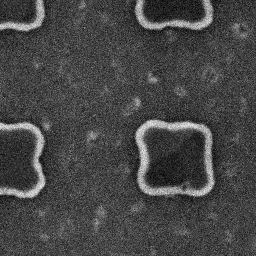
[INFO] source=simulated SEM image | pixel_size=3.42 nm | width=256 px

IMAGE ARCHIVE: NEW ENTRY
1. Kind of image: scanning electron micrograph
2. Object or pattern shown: raised bodies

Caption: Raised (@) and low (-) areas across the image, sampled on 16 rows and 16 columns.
@@@------@@@@---
@@-------@@@@---
----------------
----------------
----------------
----------------
----------------
----------------
@@-------@@@@---
@@-------@@@@---
@@-------@@@@---
@@@------@@@@---
----------------
----------------
----------------
----------------